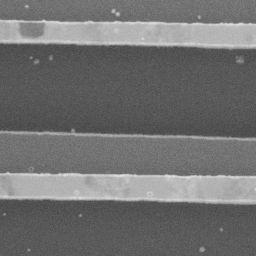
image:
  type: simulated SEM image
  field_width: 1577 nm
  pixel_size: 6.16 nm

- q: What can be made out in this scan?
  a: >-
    lines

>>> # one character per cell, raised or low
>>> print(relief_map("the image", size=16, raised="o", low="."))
oooooooooooooooo
oooooooooooooooo
oooooooooooooooo
................
................
................
................
................
ooooooo.........
oooooooooooooooo
oooooooooooooooo
oooooooooooooooo
..........oooooo
................
................
................